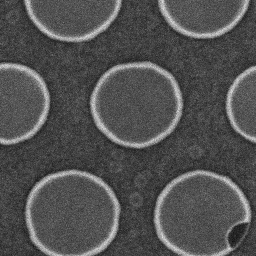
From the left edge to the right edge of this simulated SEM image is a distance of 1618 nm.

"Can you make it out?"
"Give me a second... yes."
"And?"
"raised bodies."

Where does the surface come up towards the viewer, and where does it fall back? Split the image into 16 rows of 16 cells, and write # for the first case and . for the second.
..#####...#####.
..#####....####.
................
................
##.....###.....#
###...#####...##
###...#####...##
###...#####...##
##.....###.....#
................
................
..####.....####.
..#####...#####.
..#####...#####.
..#####...####..
...###.....###..